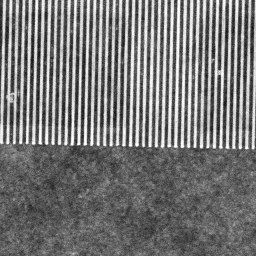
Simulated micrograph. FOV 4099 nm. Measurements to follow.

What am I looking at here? parallel lines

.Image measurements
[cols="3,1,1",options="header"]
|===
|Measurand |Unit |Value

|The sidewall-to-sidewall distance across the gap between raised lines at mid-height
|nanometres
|72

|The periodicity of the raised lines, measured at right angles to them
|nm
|103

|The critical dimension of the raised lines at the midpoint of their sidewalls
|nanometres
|30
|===